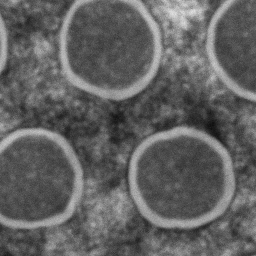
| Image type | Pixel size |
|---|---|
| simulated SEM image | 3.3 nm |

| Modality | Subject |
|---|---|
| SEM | raised bodies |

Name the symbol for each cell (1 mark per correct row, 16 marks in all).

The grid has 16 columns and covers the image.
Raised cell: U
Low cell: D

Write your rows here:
DDDDDUUUUDDDDDUU
DDDDUUUUUUDDDUUU
DDDDUUUUUUDDDUUU
DDDDUUUUUUDDDUUU
DDDDUUUUUUDDDDUU
DDDDDUUUUDDDDDDU
DDDDDDDDDDDDDDDD
DDDDDDDDDDDDDDDD
DUUDDDDDDDUUUDDD
UUUUDDDDDUUUUUDD
UUUUUDDDUUUUUUDD
UUUUUDDDUUUUUUDD
UUUUUDDDDUUUUUDD
UUUUDDDDDUUUUDDD
DDDDDDDDDDDDDDDD
DDDDDDDDDDDDDDDD